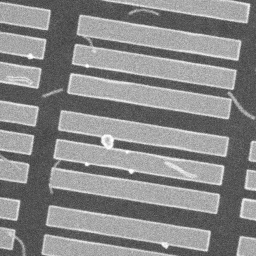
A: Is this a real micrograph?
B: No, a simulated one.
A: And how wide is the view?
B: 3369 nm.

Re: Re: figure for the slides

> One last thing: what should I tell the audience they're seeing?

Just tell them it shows groups of lines, slits or small figures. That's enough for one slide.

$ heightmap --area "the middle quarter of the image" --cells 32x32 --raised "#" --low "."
.....###########################
.............###################
..................##############
..######................########
..###########..................#
.####################...........
.##########################.....
...#############################
.........#######################
................################
......................##########
...........................#####
#####...........................
##########......................
#################...............
#######################.........
#############################...
.....###########################
.........#######################
##........##.....###############
#########.##.............#######
###############................#
#####################...........
##########################......
....############################
..........######################
................################
######................##########
############................####
###################.............
#########################.......
..##############################